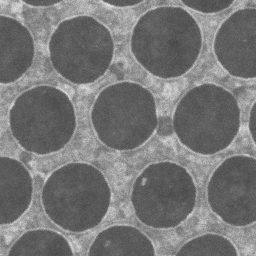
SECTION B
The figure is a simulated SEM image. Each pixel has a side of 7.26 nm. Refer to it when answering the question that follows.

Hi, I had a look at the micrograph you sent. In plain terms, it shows holes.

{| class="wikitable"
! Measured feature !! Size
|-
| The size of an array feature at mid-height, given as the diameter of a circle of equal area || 500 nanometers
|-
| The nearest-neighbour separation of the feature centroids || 599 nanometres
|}